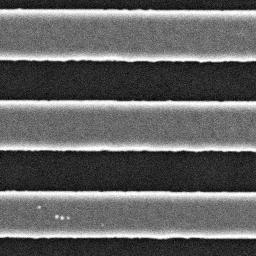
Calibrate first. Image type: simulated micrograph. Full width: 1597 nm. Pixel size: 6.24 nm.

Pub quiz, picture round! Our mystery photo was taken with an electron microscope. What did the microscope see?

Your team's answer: lines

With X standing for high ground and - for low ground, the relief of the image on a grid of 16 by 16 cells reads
----------------
XXXXXXXXXXXXXXXX
XXXXXXXXXXXXXXXX
XXXXXXXXXXXXXXXX
----------------
----------------
XXXXXXXXXXXXXXXX
XXXXXXXXXXXXXXXX
XXXXXXXXXXXXXXXX
----------------
----------------
----------------
XXXXXXXXXXXXXXXX
XXXXXXXXXXXXXXXX
XXXXXXXXXXXXXXXX
----------------